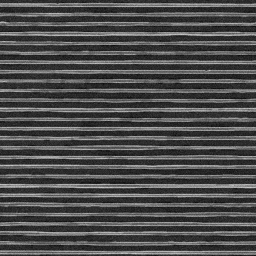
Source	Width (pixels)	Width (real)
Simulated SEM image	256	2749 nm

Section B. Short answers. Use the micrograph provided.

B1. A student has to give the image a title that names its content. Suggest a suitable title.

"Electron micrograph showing parallel lines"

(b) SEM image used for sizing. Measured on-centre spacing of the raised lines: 9.53 px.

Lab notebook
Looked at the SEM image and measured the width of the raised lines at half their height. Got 2.88 px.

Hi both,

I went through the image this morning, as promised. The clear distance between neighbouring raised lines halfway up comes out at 72.5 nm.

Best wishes